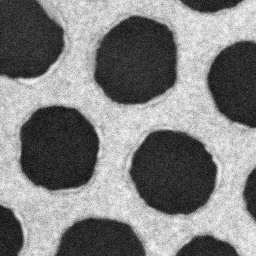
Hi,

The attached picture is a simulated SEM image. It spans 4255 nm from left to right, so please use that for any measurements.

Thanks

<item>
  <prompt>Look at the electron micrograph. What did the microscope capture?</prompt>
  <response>holes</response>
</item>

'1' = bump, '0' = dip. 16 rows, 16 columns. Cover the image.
0001111111110011
0000111000111111
0000110000011111
0000110000011100
0001110000011000
1111110000011000
1111111101111000
1100001111111100
1000001110001111
1000001100000111
1000001100000011
1100011100000010
1111111110000110
0111111111111111
0111000011111111
0111000001100001